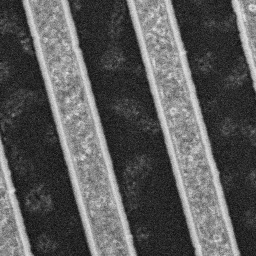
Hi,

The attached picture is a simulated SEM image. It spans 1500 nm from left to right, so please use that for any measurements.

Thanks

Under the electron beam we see one or a few lines or trenches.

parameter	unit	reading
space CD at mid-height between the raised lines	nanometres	363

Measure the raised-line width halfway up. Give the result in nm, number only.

225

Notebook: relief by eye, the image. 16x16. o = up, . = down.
..oo....ooo....o
..oo....ooo....o
..ooo....oo....o
..ooo....oo.....
...oo....ooo....
...ooo....oo....
...ooo....oo....
....oo....ooo...
....oo....ooo...
....ooo....oo...
....ooo....oo...
o....oo....ooo..
o....oo....ooo..
o....ooo....oo..
o....ooo....oo..
oo....oo....ooo.